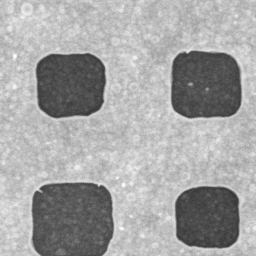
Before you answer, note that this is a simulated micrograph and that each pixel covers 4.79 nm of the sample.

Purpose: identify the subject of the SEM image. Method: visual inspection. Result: holes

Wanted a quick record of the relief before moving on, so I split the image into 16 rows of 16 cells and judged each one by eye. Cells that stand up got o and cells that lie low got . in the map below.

oooooooooooooooo
oooooooooooooooo
oooooooooooooooo
ooo...ooooo...oo
oo.....oooo....o
oo.....oooo....o
oo....ooooo....o
oooooooooooooooo
oooooooooooooooo
oooooooooooooooo
oooooooooooooooo
ooo...oooooooooo
oo.....oooo....o
oo.....oooo....o
oo.....oooo....o
oo.....oooooo.oo